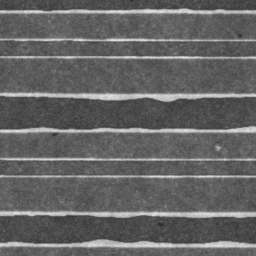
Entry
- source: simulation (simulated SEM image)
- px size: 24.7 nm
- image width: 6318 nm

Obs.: lines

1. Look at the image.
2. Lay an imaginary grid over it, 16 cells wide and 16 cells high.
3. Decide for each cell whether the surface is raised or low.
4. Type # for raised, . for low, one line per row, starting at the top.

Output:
................
################
################
################
################
################
................
................
################
################
################
################
################
................
................
################